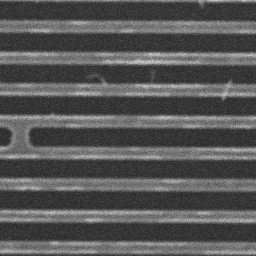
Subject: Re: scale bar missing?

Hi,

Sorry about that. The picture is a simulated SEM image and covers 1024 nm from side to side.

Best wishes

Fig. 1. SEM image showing parallel lines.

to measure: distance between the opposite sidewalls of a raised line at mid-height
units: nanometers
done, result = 46.5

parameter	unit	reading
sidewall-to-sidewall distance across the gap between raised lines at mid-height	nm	81.5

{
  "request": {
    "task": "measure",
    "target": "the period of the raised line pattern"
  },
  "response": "126 nanometres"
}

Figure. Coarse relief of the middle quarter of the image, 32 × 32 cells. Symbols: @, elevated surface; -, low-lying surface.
--------------------------------
--------------------------------
--------------------------------
--------------------------------
--------------------------------
@@@@@@@@@@@@@@@@@@@@@@@@@@@@@@@@
@@@@@@@@@@@@@@@@@@@@@@@@@@@@@@@@
@@@@@@@@@@@@@@@@@@@@@@@@@@@@@@@@
--------------------------------
--------------------------------
--------------------------------
--------------------------------
--------------------------------
@@@@@@@@@@@@@@@@@@@@@@@@@@@@@@@@
@@@@@@@@@@@@@@@@@@@@@@@@@@@@@@@@
@@@@@@@@@@@@@@@@@@@@@@@@@@@@@@@@
--------------------------------
--------------------------------
--------------------------------
--------------------------------
--------------------------------
@@@@@@@@@@@@@@@@@@@@@@@@@@@@@@@@
@@@@@@@@@@@@@@@@@@@@@@@@@@@@@@@@
@-@@@@@@@@@-@@@@@@@@@@@@@@@@@@@@
--------------------------------
--------------------------------
--------------------------------
--------------------------------
--------------------------------
@@@@@@@@@@@@@@@@@@@@@@@@@@@@@@@@
@@@@@@@@@@@@@@@@@@@@@@@@@@@@@@@@
-----------------------------@@@